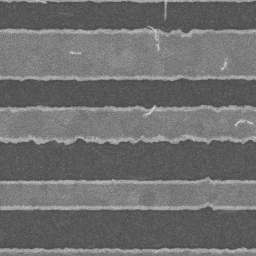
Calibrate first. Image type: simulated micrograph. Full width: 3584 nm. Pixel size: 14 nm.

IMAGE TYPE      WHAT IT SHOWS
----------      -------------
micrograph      one or a few lines or trenches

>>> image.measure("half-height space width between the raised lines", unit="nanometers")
528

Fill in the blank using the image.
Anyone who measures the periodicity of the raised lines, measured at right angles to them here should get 982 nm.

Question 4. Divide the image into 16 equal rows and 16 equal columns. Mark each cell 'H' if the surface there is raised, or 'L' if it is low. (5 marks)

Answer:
LLLLLLLLLLLLLLLL
LLLLLLLLLLLLLLLL
HHHHHHHHHHHHHHHH
HHHHHHHHHHHHHHHH
HHHHHHHHHHHHHHHH
LLLLLLLLLLLLLLLL
LLLLLLLLLLLLLLLL
HHHHHHHHHHHHHHHH
HHHHHHHHHHHHHHHH
LLLLLLLLLLLLLLLL
LLLLLLLLLLLLLLLL
HHHHHHHHHHHHHHHH
HHHHHHHHHHHHHHHH
LLLLLLLLLLLLLLLL
LLLLLLLLLLLLLLLL
LLLLLLLLLLLLLLLL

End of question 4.